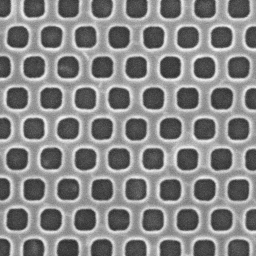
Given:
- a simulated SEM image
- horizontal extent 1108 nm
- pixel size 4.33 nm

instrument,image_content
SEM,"a regular array of holes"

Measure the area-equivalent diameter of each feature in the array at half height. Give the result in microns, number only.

0.105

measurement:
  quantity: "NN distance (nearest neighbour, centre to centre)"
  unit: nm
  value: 146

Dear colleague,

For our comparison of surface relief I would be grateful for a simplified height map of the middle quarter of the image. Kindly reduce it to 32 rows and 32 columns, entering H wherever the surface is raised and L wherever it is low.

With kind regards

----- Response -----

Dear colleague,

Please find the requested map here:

LLLLHHHLLLLLLHHLLLLLLHHHLLLLLHHH
LLLLHHHLLLLLLHHLLLLLLHHHLLLLLLHH
LLLLHHHLLLLLHHHLLLLLLHHHLLLLLHHH
LLLHHHHHLLLLHHHHLLLLHHHHHLLLLHHH
HHHHHHHHHHHHHHHHHHHHHHHHHHHHHHHH
HHHHHHHHHHHHHHHHHHHHHHHHHHHHHHHH
HHHLLLLLHHHLLLLLHHHHLLLLLHHHLLLL
HHHLLLLLHHHLLLLLHHHHLLLLLHHHLLLL
HHLLLLLLHHHLLLLLLHHLLLLLLHHHLLLL
HHLLLLLLHHHLLLLLLHHHLLLLLHHHLLLL
HHHLLLLLHHHLLLLLHHHHLLLLLHHHLLLL
HHHHLLLHHHHHHLLHHHHHHLLLHHHHHHLH
HHHHHHHHHHHHHHHHHHHHHHHHHHHHHHHH
LLLHHHHHLLLHHHHHHLLLHHHHHLLLHHHH
LLLLHHHLLLLLHHHHLLLLLHHHLLLLLHHH
LLLLHHHLLLLLHHHLLLLLLHHHLLLLLLHH
LLLLHHHLLLLLHHHLLLLLLHHHLLLLLLHH
LLLLHHHLLLLLHHHLLLLLLHHHLLLLLHHH
LLLHHHHLLLLLHHHHLLLLHHHHLLLLLHHH
HHHHHHHHHHHHHHHHHHHHHHHHHHHHHHHH
HHHHHHHHHHHHHHHHHHHHHHHHHHHHHHHH
HHHLLLLLHHHHLLLLHHHHLLLLLHHHHLLL
HHHLLLLLHHHLLLLLHHHHLLLLLHHHLLLL
HHLLLLLLHHHLLLLLLHHLLLLLLHHHLLLL
HHLLLLLLHHHLLLLLLHHLLLLLLHHHLLLL
HHHLLLLLHHHLLLLLHHHHLLLLLHHHLLLL
HHHHLLLHHHHHLLLHHHHHHLLHHHHHHLLL
HHHHHHHHHHHHHHHHHHHHHHHHHHHHHHHH
LLLHHHHHHHHHHHHHHLLHHHHHHHHLHHHH
LLLLHHHLLLLLHHHLLLLLLHHHLLLLLHHH
LLLLHHHLLLLLHHHLLLLLLHHHLLLLLHHH
LLLLHHHLLLLLHHHLLLLLLHHLLLLLLHHH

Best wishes